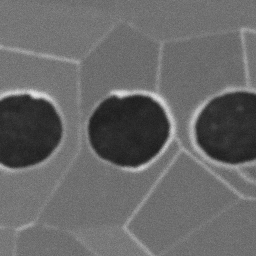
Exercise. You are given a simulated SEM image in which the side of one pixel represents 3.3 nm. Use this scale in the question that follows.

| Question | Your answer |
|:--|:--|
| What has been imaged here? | holes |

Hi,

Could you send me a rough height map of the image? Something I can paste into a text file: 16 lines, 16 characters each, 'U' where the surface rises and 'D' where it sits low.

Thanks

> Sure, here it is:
UUUUUUUUUUUUUUUU
UUUUUUUUUUUUUUUU
UUUUUUUUUUUUUUUU
UUUUUUUUUUUUUUUU
UUUUUUUUUUUUUUUU
UUUUUUUUUUUUUUUU
DDDUUUDDDDUUUDDD
DDDDUUDDDDDUDDDD
DDDDUUDDDDDUDDDD
DDDUUUDDDDUUUDDD
UUUUUUUUUUUUUUUU
UUUUUUUUUUUUUUUU
UUUUUUUUUUUUUUUU
UUUUUUUUUUUUUUUU
UUUUUUUUUUUUUUUU
UUUUUUUUUUUUUUUU